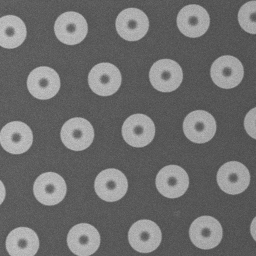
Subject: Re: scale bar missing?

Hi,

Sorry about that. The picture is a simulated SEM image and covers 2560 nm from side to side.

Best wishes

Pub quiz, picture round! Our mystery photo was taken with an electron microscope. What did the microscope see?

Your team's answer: an array of small figures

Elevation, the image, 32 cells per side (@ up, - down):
-------------------------------@
--------@------@@@----@@@@----@@
@@@----@@@@----@@@@---@@@@----@@
@@@----@@@@----@@@@---@@@@----@@
@@@----@@@@----@@@-----@@-------
@@@-----@-----------------------
--------------------------------
--------------------@------@@@--
-----@------@@@----@@@@---@@@@--
----@@@----@@@@----@@@@---@@@@--
---@@@@----@@@@----@@@@----@@@--
----@@@-----@@------------------
--------------------------------
--------------------------------
----------------@@-----@@@-----@
-@@-----@@@----@@@@----@@@@----@
@@@@----@@@@---@@@@----@@@@----@
@@@@----@@@@----@@@-----@@------
@@@@-----@@---------------------
--------------------------------
----------------------------@@--
-------------@@-----@@@----@@@@-
-----@@@----@@@@----@@@@---@@@@-
@---@@@@----@@@@----@@@-----@@@-
@---@@@@----@@@------@@---------
-----@@-------------------------
--------------------------------
------------------------@@@-----
--@@-----@@@----@@@@----@@@@---@
-@@@@---@@@@----@@@@----@@@@----
-@@@@---@@@@----@@@@----@@@-----
-@@@@----@@@-----@@-------------